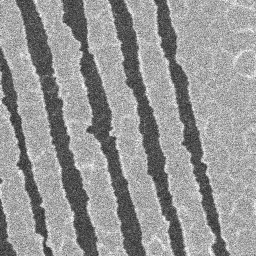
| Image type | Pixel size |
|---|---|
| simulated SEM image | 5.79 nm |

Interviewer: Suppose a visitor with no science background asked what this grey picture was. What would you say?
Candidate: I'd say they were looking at parallel lines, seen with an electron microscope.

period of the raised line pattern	248	nanometres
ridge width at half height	150	nm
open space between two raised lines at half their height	16.3	px